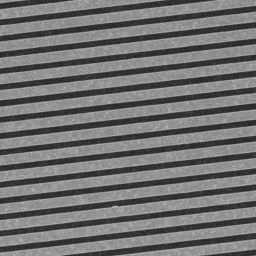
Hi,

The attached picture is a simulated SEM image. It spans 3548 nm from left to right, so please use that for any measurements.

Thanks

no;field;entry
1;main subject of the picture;parallel lines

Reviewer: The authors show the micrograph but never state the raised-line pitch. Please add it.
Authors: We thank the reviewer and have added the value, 223 nm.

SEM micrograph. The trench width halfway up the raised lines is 84.3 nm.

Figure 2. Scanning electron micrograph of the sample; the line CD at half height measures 136 nm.